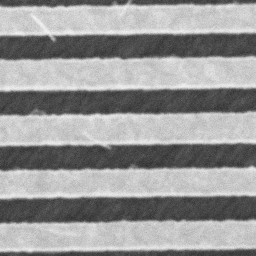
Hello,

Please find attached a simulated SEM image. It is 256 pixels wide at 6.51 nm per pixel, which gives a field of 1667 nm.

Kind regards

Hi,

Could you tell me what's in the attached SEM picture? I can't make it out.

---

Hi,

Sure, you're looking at lines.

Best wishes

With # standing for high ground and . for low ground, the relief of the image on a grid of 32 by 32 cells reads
................................
################################
################################
################################
................................
................................
................................
......#..#######################
################################
################################
################################
................................
................................
................................
...#..#.########################
################################
################################
################################
................................
................................
................................
################################
################################
################################
#######.##......................
................................
................................
................................
################################
################################
################################
................................